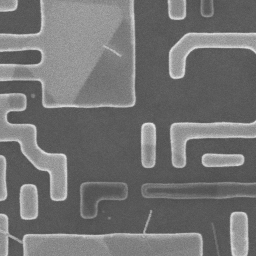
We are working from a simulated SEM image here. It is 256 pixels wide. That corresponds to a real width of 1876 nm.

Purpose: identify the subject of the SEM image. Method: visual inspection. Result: wiring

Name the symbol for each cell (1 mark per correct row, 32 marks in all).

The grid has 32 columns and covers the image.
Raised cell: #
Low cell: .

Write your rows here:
##...############....##..##.....
.....############....##..##.....
.....############...............
.....############...............
#################......#########
#################.....##########
.....############....###........
.....############....##.........
#################....##.........
#################....##.........
.....############...............
.....############...............
###..############...............
###.............................
#...............................
##................#...##########
####..............#..###########
#####.............#..###........
...##.............#..##.........
...#####..........#...#...####..
#...####..........#...#..#####..
#.....##........................
#.....##........................
#..#..##..######..##############
#..##.##..######..##############
...##.....##....................
...##.....##....................
#............................##.
#............................##.
#..######################....##.
#..######################....##.
#..######################....##.